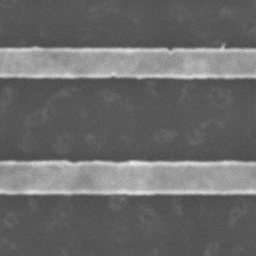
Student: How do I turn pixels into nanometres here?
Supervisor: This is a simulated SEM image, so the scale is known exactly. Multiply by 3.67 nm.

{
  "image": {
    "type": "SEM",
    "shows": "one or a few lines or trenches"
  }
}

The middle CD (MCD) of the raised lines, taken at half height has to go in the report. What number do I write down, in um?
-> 0.108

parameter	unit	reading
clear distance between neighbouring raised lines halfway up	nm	314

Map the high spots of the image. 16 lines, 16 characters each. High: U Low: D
DDDDDDDDDDDDDDDD
DDDDDDDDDDDDDDDD
DDDDDDDDDDDDDDDD
UUUUUUUUUUUUUUUU
UUUUUUUUUUUUUUUU
DDDDDDDDDDDDDDDD
DDDDDDDDDDDDDDDD
DDDDDDDDDDDDDDDD
DDDDDDDDDDDDDDDD
DDDDDDDDDDDDDDDD
UUUUUUUUUUUUUUUU
UUUUUUUUUUUUUUUU
DDDDDDDDDDDDDDDD
DDDDDDDDDDDDDDDD
DDDDDDDDDDDDDDDD
DDDDDDDDDDDDDDDD